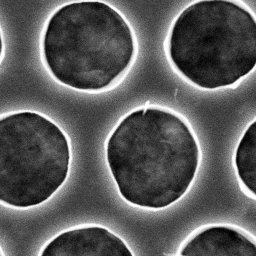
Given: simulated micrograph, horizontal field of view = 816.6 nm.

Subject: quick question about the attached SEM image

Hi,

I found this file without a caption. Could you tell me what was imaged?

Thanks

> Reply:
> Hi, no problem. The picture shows holes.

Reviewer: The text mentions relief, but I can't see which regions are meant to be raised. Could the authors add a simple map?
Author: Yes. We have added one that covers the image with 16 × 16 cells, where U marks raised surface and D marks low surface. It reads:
UUUUDDDUUUUUDDDU
UUUDDDDDUUUDDDDD
UUUDDDDDUUUDDDDD
UUUDDDDDUUUDDDDD
UUUDDDDDUUUDDDDU
UUUUUDDUUUUUUUUU
UUUUUUUUUUUUUUUU
DDDUUUUUDDDUUUUU
DDDDUUUDDDDDUUUD
DDDDUUUDDDDDUUUD
DDDDUUUDDDDDUUUD
DDDDUUUDDDDDUUUD
DDDUUUUUDDDUUUUU
UUUUUUUUUUUUUUUU
UUUUDDDUUUUUDDDU
UUUDDDDDUUUDDDDD